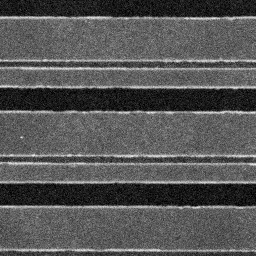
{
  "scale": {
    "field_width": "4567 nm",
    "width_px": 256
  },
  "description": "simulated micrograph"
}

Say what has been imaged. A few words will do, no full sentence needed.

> lines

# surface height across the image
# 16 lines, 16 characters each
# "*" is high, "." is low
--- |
................
****************
****************
****************
****************
................
................
****************
****************
****************
****************
................
................
****************
****************
****************